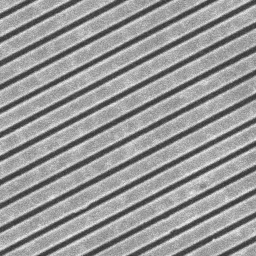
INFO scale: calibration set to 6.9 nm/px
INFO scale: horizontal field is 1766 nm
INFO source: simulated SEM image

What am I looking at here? parallel lines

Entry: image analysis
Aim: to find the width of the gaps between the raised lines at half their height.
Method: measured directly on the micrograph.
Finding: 48.1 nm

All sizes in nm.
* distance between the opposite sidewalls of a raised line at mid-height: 95.5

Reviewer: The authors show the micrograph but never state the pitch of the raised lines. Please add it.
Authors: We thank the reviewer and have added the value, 145 nm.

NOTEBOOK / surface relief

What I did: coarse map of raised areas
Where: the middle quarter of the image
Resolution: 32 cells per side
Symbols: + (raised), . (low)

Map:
++++....+++++++....++++++++....+
++....+++++++....++++++++....+++
....+++++++....++++++++....+++++
..+++++++....++++++++....+++++++
+++++++....++++++++....+++++++..
+++++....++++++++....+++++++....
+++....++++++++....+++++++....++
+....++++++++....+++++++....++++
....+++++++....+++++++....++++++
..+++++++....++++++++....+++++++
+++++++....++++++++....+++++++..
++++++....+++++++....+++++++....
++++....+++++++....+++++++....++
++....+++++++....+++++++....++++
....+++++++....+++++++....++++++
..+++++++....+++++++....++++++++
+++++++....+++++++....++++++++..
+++++....++++++++...++++++++....
+++....++++++++....+++++++....++
+....++++++++....+++++++....++++
....+++++++....+++++++....++++++
..+++++++....+++++++....++++++++
+++++++....+++++++....++++++++..
+++++....+++++++....++++++++....
+++....+++++++.....+++++++....++
+....++++++++...++++++++....++++
...++++++++....+++++++....++++++
.++++++++....+++++++....++++++++
+++++++....+++++++....++++++++..
+++++....++++++++...++++++++....
+++....++++++++....+++++++....++
+....++++++++....+++++++....++++